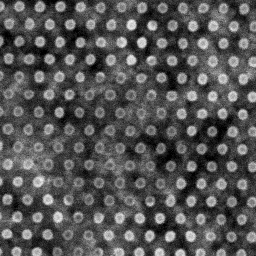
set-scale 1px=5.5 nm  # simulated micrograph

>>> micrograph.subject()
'a regular array of raised bodies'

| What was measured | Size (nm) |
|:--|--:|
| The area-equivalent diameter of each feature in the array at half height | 50.4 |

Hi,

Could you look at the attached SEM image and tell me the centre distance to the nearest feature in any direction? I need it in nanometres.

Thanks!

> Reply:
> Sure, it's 110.